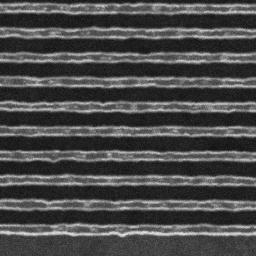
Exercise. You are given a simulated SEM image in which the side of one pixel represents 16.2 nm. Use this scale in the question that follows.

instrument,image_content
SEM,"parallel lines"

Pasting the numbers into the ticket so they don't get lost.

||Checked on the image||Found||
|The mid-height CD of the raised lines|145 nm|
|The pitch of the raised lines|0.398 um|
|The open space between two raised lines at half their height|259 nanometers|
